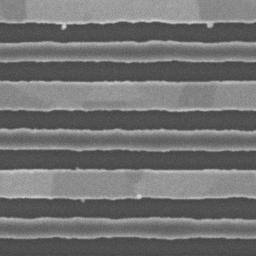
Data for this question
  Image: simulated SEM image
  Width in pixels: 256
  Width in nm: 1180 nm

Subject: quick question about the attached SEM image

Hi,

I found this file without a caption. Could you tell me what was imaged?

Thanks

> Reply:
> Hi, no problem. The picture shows lines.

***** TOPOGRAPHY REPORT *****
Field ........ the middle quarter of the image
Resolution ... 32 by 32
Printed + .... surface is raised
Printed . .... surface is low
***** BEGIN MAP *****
................................
................................
................................
................................
.....................++.........
++++++++++++++++++++++++++++++++
++++++++++++++++++++++++++++++++
++++++++++++++++++++++++++++++++
++++++++++++++++++++++++++++++++
++++++++++++++++++++++++++++++++
++++++++++++++++++++++++++++++++
.++.++++..++..+++.+++....+++++++
................................
................................
................................
................................
................................
++++++++++++++++++++++++++++++++
++++++++++++++++++++++++++++++++
++++++++++++++++++++++++++++++++
++++++++++++++++++++++++++++++++
...++...............+++++++.....
................................
................................
................................
................................
+..+++++.++..++++..+++..........
++++++++++++++++++++++++++++++++
++++++++++++++++++++++++++++++++
++++++++++++++++++++++++++++++++
++++++++++++++++++++++++++++++++
++++++++++++++++++++++++++++++++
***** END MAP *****